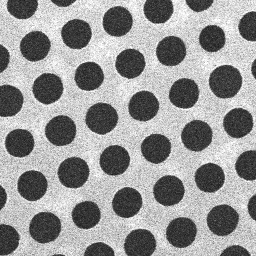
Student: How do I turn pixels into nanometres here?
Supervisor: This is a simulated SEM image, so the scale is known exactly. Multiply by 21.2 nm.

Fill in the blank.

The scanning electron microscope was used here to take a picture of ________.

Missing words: a regular array of holes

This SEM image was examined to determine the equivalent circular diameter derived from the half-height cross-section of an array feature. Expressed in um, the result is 0.65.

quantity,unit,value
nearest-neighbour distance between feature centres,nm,908